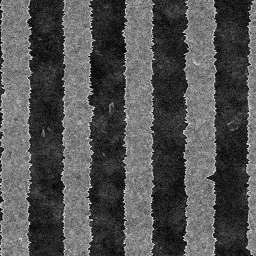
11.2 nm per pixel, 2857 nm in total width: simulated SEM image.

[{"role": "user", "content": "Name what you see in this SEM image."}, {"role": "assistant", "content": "one or a few lines or trenches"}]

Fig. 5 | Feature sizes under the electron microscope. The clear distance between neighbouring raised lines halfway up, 383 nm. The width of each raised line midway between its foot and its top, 300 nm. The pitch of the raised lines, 685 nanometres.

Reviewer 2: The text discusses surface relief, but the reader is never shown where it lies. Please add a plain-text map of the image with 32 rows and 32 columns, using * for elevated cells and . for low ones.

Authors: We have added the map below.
****....***.....***....****.....
****....***.....***....****....*
****....***.....***....****....*
****....***.....***....****....*
****....***.....***....*****...*
****....****....***....****....*
****....***.....***....****....*
****....***.....***....****....*
****....***.....***....****....*
****....***.....***....****....*
****....***.....***.....***....*
.***....***.....***....****....*
****....***.....***....****....*
****....****....***....****....*
****....****....***....****....*
***.....***.....***....****....*
****....***.....***....****....*
****....***.....***....****....*
****....***.....***....****....*
****....***.....***....****....*
****....***.....***....****....*
****....***.....***....****....*
****....***.....***....***.....*
****....***.....***....****....*
***.....***.....***....****....*
****....***.....***....****....*
****....***.....***....****....*
****....***.....***....****....*
****....***.....***....****....*
***.....***.....***....****....*
****....***.....***....****....*
****....***.....***....****....*